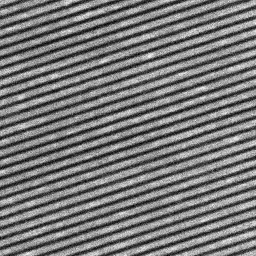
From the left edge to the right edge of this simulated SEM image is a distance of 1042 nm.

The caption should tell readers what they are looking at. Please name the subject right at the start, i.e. parallel lines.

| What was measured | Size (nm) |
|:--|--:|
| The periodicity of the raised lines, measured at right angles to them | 38.9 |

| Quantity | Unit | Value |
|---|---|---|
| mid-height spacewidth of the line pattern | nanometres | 17.4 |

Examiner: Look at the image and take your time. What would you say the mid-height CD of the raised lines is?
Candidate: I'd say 20.8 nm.